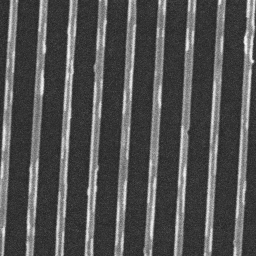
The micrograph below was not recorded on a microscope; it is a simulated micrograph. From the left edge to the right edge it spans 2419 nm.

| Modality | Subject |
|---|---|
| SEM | parallel lines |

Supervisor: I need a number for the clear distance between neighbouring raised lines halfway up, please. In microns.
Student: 0.205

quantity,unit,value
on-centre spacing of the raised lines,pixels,29.6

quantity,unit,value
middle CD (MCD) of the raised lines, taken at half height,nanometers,68.4